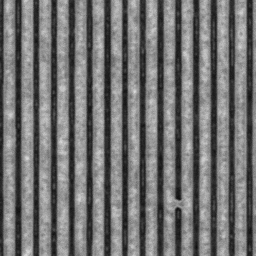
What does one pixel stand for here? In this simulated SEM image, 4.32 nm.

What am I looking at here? parallel lines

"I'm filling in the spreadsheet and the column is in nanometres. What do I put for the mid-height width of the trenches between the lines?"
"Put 29.1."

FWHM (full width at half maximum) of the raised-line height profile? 47.5 nanometers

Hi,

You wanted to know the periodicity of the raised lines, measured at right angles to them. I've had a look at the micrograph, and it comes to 76.8 nm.